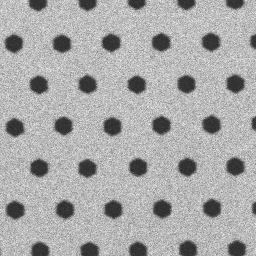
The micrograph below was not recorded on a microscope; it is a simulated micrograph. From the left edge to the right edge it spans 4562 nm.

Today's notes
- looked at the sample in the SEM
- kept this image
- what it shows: a regular array of holes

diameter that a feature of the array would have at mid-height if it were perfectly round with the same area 322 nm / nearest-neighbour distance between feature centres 848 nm